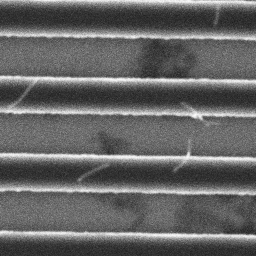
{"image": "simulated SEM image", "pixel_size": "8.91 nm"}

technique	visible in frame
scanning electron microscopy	lines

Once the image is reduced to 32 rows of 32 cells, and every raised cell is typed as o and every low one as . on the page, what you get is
oooooooooooooooooooooooooooooooo
oooooooooooooooooooooooooooooooo
oooooooooooooooooooooooooooooooo
oooooooooooooooooooooooooooooooo
......o.oooooooooooooooooooooooo
................................
................................
................................
................................
................................
oooooooooooooooooooooooooooooooo
oooooooooooooooooooooooooooooooo
oooooooooooooooooooooooooooooooo
oooooooooooooooooooooooooooooooo
........................oo......
................................
................................
................................
................................
ooooooooo.o.....................
oooooooooooooooooooooooooooooooo
oooooooooooooooooooooooooooooooo
oooooooooooooooooooooooooooooooo
oooooooooooooooooooooooooooooooo
................................
................................
................................
................................
................................
ooooooooooooooooooooooooooooooo.
oooooooooooooooooooooooooooooooo
oooooooooooooooooooooooooooooooo